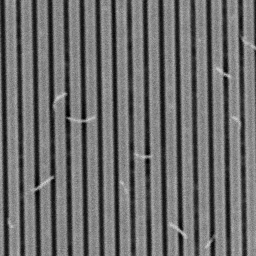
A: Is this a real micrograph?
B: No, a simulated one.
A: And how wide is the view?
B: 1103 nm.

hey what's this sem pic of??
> parallel lines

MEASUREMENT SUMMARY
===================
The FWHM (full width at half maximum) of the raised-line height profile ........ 0.0464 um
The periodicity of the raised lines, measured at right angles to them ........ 68.4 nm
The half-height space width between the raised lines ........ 4.87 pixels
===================